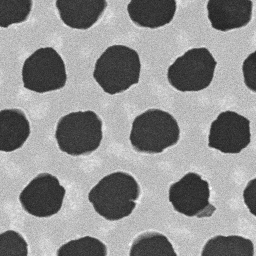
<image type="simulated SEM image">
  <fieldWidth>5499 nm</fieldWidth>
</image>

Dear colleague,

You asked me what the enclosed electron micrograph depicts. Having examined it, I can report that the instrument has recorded a regular array of holes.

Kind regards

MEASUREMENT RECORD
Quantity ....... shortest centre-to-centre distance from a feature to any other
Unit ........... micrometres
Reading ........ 1.55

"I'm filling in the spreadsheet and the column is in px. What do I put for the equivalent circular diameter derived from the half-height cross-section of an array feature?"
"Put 45.3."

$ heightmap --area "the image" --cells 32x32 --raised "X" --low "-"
----XXX------XXX------XXXX-----X
----XXX------XXX------XXXX-----X
---XXXXX----XXXX------XXXX-----X
XXXXXXXXX--XXXXXXXXXXXXXXXX---XX
XXXXXXXXXXXXXXXXXXXXXXXXXXXXXXXX
XXXXXXXXXXXXXXXXXXXXXXXXXXXXXXXX
XXXX---XXXXXX----XXXXXX---XXXXXX
XXX-----XXXX------XXXX-----XXXX-
XXX-----XXXX------XXX------XXX--
XXX-----XXXX-----XXXX------XXX--
XXX-----XXXX-----XXXX-----XXXXX-
XXXX--XXXXXXX--XXXXXXXXXXXXXXXXX
XXXXXXXXXXXXXXXXXXXXXXXXXXXXXXXX
XXXXXXXXXXXXXXXXXXXXXXXXXXXXXXXX
---XXXXX----XXXXX-----XXXXX---XX
----XXX------XXXX-----XXXX-----X
----XXX------XXX------XXXX-----X
---XXXX------XXX------XXXX-----X
--XXXXX-----XXXXX----XXXXXX----X
XXXXXXXXXXXXXXXXXXXXXXXXXXXXXXXX
XXXXXXXXXXXXXXXXXXXXXXXXXXXXXXXX
XXXXXXXXXXXXXX-XXXXXXXXXXXXXXXXX
XXXX---XXXXXX----XXXXX----XXXXX-
XXX-----XXXX-----XXXX-----XXXXX-
XX------XXX------XXXX-----XXXX--
XXX-----XXX------XXXX-----XXXXX-
XXX----XXXXX----XXXXXX---XXXXXX-
XXXXXXXXXXXXX--XXXXXXXXXXXXXXXXX
XXXXXXXXXXXXXXXXXXXXXXXXXXXXXXXX
---XXXXXXXXXXXXXXX---XXXXXX---XX
---XXXXX-----XXXX----XXXXX------
---XXXX------XXX------XXX-------